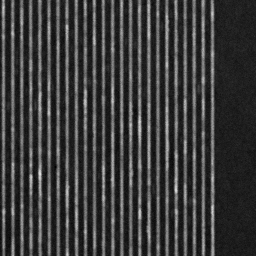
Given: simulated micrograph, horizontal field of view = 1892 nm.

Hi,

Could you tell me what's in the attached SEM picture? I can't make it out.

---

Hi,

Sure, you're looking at parallel lines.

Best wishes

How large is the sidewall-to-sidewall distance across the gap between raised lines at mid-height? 0.0545 um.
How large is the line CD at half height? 15.7 nm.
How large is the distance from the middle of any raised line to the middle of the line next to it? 0.067 um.